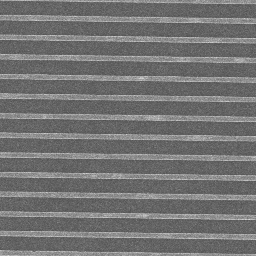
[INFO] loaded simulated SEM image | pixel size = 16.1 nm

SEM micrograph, parallel lines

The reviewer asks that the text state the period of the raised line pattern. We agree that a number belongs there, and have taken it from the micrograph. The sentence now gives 316 nanometers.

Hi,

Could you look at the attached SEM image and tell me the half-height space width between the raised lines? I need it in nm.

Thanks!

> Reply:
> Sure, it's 238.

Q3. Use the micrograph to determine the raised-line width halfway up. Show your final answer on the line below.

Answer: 82.5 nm